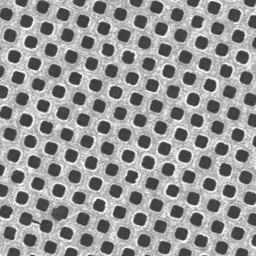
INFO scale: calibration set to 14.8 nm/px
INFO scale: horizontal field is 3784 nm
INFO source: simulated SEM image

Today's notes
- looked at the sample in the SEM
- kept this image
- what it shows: a regular array of holes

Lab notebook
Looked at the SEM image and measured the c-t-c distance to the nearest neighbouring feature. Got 312 nanometres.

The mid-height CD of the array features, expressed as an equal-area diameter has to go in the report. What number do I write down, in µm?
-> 0.202